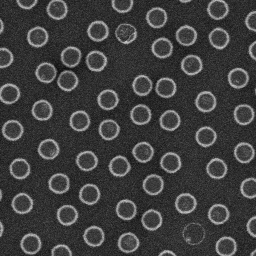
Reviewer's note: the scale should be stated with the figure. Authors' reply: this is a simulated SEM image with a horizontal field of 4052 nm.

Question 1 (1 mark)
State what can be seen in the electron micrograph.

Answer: a regular array of raised bodies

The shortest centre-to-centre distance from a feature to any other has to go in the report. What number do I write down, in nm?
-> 483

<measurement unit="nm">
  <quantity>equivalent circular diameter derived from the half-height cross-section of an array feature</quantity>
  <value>302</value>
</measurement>